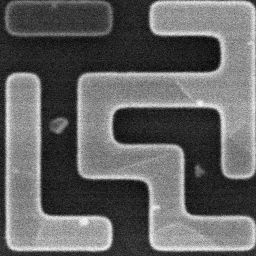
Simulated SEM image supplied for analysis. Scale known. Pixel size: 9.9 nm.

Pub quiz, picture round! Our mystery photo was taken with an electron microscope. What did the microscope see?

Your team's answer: wiring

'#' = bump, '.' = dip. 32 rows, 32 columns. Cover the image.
.############......############.
.#############.....#############
.#############.....#############
.#############.....#############
...........................#####
............................####
............................####
............................####
...........................#####
.###......######################
.####.....######################
.####.....######################
.####.....######################
.####.....#####............#####
.####.....####..............####
.####.....####..............####
.####.....####..............####
.####.....####..............####
.####.....############......####
.####.....#############.....####
.####.....#############.....####
.####.....#############.....####
.####.............#####.........
.####..............####.........
.####..............####.........
.####..............####.........
.####..............####.........
.############......############.
.#############.....#############
.#############.....#############
.#############.....#############
................................